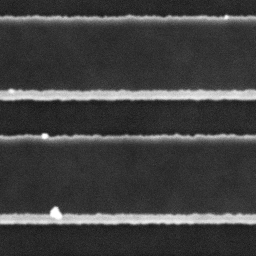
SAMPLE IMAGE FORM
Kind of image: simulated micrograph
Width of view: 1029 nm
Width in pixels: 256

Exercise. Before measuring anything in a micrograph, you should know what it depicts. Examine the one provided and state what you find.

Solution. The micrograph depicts lines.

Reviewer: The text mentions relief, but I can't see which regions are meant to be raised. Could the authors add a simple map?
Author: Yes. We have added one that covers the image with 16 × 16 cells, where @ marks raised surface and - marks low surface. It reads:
----------------
@@@@@@@@@@@@@@@@
@@@@@@@@@@@@@@@@
@@@@@@@@@@@@@@@@
@@@@@@@@@@@@@@@@
@@@@@@@@@@@@@@@@
----------------
----------------
--@-------------
@@@@@@@@@@@@@@@@
@@@@@@@@@@@@@@@@
@@@@@@@@@@@@@@@@
@@@@@@@@@@@@@@@@
@@@@@@@@@@@@@@@@
----------------
----------------